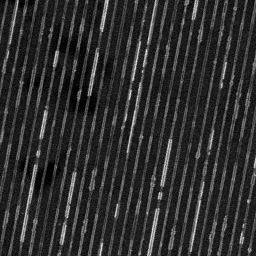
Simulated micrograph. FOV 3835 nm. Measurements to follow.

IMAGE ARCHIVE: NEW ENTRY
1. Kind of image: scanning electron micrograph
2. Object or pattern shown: parallel lines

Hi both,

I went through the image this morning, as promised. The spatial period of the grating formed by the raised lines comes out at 0.147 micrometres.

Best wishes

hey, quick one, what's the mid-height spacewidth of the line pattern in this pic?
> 112 nanometres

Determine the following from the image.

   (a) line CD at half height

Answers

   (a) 36.8 nm